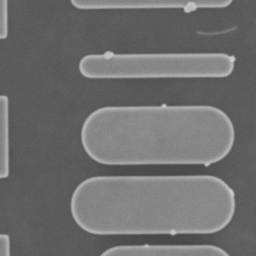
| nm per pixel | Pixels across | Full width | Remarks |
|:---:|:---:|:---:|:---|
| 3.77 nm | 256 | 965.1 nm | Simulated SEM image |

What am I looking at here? groups of lines, slits or small figures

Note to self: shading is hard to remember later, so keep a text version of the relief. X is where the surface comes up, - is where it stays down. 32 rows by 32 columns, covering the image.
X--------XXXXXXXXXXXXXXXXXXXX---
X----------------------X--------
X-------------------------------
X-------------------------------
X-------------------------------
--------------------------------
--------------------------------
----------XXXXXXXXXXXXXXXXXXX---
----------XXXXXXXXXXXXXXXXXXX---
-----------XXXXXXXXXXXXXXXXX----
--------------------------------
--------------------------------
X-------------------------------
X------------XXXXXXXXXXXXXX-----
X----------XXXXXXXXXXXXXXXXX----
X----------XXXXXXXXXXXXXXXXXX---
X---------XXXXXXXXXXXXXXXXXXX---
X---------XXXXXXXXXXXXXXXXXXX---
X----------XXXXXXXXXXXXXXXXXX---
X----------XXXXXXXXXXXXXXXXX----
X------------XXXXXX------X------
X-------------------------------
-----------XXXXXXXXXXXXXXXXX----
----------XXXXXXXXXXXXXXXXXXX---
---------XXXXXXXXXXXXXXXXXXXX---
---------XXXXXXXXXXXXXXXXXXXX---
---------XXXXXXXXXXXXXXXXXXXX---
---------XXXXXXXXXXXXXXXXXXXX---
----------XXXXXXXXXXXXXXXXXX----
X-------------------------------
X-------------------------------
X------------XXXXXXXXXXXXXXX----